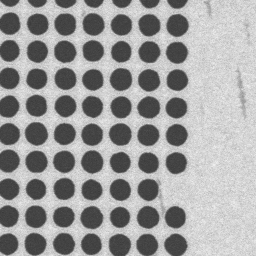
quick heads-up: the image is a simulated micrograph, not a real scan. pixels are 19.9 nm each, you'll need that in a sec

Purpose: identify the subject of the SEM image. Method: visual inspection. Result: a regular array of holes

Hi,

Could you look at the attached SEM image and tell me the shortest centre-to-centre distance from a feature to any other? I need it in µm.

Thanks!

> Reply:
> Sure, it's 0.538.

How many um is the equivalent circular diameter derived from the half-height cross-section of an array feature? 0.436